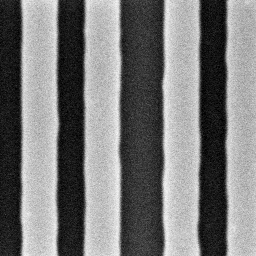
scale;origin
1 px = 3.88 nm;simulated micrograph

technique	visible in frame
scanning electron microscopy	groups of lines, slits or small figures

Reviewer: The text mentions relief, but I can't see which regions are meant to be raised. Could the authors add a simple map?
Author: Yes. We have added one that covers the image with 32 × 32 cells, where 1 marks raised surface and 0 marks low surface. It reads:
00011110000111100000011110001111
00011110000111100000011110001111
00011110000111100000011110001111
00011110000111100000011110001111
00011110000111100000011110001111
00011110000111100000011110001111
00011110000111100000011110001111
00011110000111100000011110001111
00011110000111100000011110001111
00011110000111100000011110001111
00011110000111100000111110001111
00011110000111100000111110001111
00011110000111100000011110001111
00011110000111100000011110001111
00011110000111100000011110001111
00011110000111100000011110001111
00011110000111100000011110001111
00011110000111100000011110001111
00011110000111100000011110001111
00011110000111100000011110001111
00011110000111100000011110001111
00011110000111100000011110001111
00011110000111100000111110001111
00011110000111100000111110001111
00011110000111100000111110001111
00011110000111100000011110000111
00011110000111100000111110000111
00011110000111100000111110001111
00011110000111100000011110001111
00011110000111100000011110001111
00011110000111100000011110001111
00011110000111100000011110001111